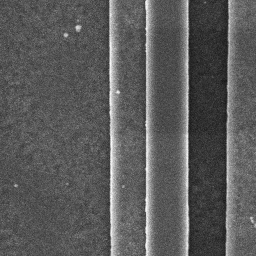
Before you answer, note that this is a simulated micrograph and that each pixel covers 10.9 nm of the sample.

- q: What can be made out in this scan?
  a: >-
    lines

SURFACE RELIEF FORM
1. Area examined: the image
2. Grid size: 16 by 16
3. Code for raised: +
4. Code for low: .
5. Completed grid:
.......+++++..++
.......+++++..++
.......+++++..++
.......+++++..++
.......+++++..++
.......+++++..++
.......+++++..++
.......+++++..++
.......+++++..++
.......+++++..++
.......+++++..++
.......+++++..++
.......+++++..++
.......+++++..++
.......+++++..++
.......+++++..++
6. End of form